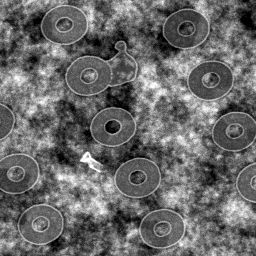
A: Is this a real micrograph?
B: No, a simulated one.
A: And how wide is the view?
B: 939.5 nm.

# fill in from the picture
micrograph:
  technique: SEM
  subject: a regular array of ring-shaped raised bodies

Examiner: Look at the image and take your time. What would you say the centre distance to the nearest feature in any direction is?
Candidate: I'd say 56.7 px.